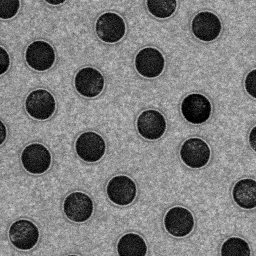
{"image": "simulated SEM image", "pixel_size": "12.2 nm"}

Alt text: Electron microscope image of a regular array of holes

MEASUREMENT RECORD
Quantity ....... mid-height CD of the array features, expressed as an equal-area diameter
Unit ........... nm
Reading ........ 375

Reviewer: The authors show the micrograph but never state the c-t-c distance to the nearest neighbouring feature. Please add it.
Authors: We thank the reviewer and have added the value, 639 nm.